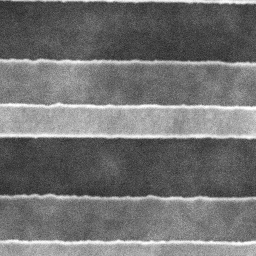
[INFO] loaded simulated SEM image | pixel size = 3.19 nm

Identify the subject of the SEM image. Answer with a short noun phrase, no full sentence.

lines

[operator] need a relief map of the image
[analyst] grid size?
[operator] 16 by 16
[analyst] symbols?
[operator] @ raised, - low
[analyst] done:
----------------
----------------
----------------
----------------
@@@@@@@@@@@@@@@@
@@@@@@@@@@@@@@@@
@@@@@@@@@@@@@@@@
@@@@@@@@@@@@@@@@
@@@@@@@@@@@@@@@@
----------------
----------------
----------------
@@@@@@@@@@@@@@@@
@@@@@@@@@@@@@@@@
@@@@@@@@@@@@@@@@
@@@@@@@@@@@@@@@@